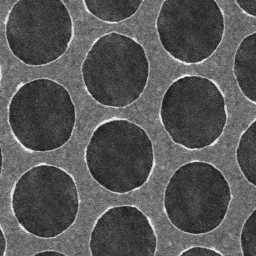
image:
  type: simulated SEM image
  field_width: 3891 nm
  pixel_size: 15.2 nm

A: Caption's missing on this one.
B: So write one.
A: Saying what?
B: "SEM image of holes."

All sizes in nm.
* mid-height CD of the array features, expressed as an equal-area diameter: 1060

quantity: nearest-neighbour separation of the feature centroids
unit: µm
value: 1.3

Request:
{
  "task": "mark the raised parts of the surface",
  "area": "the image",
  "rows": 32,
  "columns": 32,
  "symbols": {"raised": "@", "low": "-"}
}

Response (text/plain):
@@------@@@-------@@-------@@@--
@--------@@------@@@--------@@@-
@--------@@@@--@@@@@--------@@@@
@--------@@@@@@@@@@@--------@@@@
@--------@@@@---@@@@--------@@@-
@--------@@@-----@@@-------@@@--
@@------@@@-------@@@------@@@--
@@@----@@@@-------@@@@---@@@@---
@@@@@@@@@@---------@@@@@@@@@@---
@@@@@@@@@@--------@@@@@@-@@@@---
@@@----@@@@-------@@@------@@@--
@@-------@@-------@@@-------@@--
@--------@@@-----@@@--------@@@-
@--------@@@@@@@@@@@--------@@@@
@--------@@@@@@@@@@@--------@@@@
@--------@@@@----@@@--------@@@-
@@-------@@@------@@@-------@@@-
@@-------@@--------@@@-----@@@--
@@@----@@@@--------@@@@--@@@@@--
@@@@@@@@@@@--------@@@@@@@@@@@--
@@@@@@@@@@@--------@@@@---@@@@--
@@@-----@@@--------@@@------@@--
@@-------@@@------@@@-------@@@-
@@--------@@@----@@@@--------@@@
@@--------@@@@@@@@@@@--------@@@
@---------@@@@@@@@@@@--------@@@
@@--------@@@-----@@@-------@@@@
@@-------@@@-------@@-------@@@-
@@@-----@@@@-------@@@-----@@@--
-@@@@--@@@@--------@@@@@@@@@@@--
-@@@@@@@@@@---------@@@@@@@@@@--
-@@@@--@@@@--------@@@@----@@@--